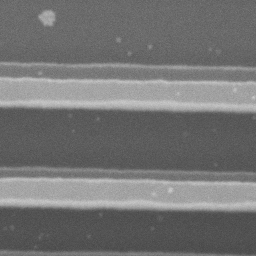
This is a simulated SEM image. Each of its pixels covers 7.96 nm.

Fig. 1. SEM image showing lines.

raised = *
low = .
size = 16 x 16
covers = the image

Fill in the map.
................
................
................
................
................
****************
****************
................
................
................
................
****************
****************
................
................
................